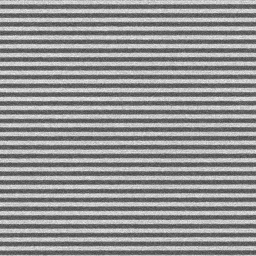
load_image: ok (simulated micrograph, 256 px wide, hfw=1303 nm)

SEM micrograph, parallel lines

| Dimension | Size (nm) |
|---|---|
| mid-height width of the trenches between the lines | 24.2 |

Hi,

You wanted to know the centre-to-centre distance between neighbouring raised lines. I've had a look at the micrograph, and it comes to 44.7 nm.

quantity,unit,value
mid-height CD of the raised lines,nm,19.1